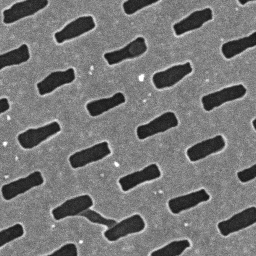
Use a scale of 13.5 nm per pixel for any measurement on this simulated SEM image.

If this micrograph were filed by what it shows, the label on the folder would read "a regular array of holes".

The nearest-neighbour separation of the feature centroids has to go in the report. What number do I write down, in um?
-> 0.717